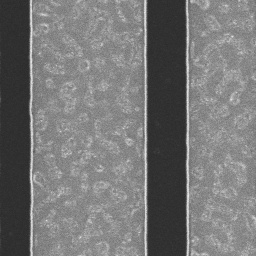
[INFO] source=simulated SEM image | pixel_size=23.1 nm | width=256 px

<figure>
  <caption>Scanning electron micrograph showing one or a few lines or trenches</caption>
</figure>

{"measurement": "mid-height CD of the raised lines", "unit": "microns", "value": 0.98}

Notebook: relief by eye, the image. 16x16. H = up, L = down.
HHLLLLLLLHHHLLLL
HHLLLLLLLHHHLLLL
HHLLLLLLLHHHLLLL
HHLLLLLLLHHHLLLL
HHLLLLLLLHHHLLLL
HHLLLLLLLHHHLLLL
HHLLLLLLLHHHLLLL
HHLLLLLLLHHHLLLL
HHLLLLLLLHHHLLLL
HHLLLLLLLHHHLLLL
HHLLLLLLLHHHLLLL
HHLLLLLLLHHHLLLL
HHLLLLLLLHHHLLLL
HHLLLLLLLHHHLLLL
HHLLLLLLLHHHLLLL
HHLLLLLLLHHHLLLL